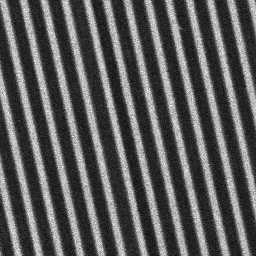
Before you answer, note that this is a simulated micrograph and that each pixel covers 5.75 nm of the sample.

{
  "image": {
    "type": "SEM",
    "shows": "parallel lines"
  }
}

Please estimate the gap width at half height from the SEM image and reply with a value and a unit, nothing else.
70.1 nm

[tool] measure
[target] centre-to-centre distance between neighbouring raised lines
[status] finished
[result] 0.116 micrometres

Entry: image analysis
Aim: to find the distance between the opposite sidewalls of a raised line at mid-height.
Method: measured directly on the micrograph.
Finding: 44.9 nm